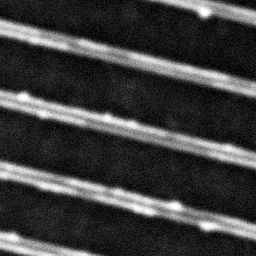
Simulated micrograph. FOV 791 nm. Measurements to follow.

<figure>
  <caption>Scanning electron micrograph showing one or a few lines or trenches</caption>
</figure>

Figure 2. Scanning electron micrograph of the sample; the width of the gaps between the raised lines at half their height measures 176 nm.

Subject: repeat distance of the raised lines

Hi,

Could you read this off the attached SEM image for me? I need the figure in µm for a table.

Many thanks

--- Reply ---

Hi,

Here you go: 0.213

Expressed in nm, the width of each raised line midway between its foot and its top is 37.1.